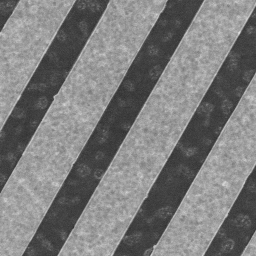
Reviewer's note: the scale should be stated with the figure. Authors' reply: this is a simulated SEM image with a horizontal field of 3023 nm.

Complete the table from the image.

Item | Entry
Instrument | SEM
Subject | one or a few lines or trenches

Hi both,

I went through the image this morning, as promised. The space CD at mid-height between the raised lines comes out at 378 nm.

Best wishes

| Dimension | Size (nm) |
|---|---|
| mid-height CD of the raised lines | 547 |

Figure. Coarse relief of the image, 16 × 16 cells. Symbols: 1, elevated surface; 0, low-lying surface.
0111000111000111
1111001111001110
1110001110011110
1110011100011100
1100111100111100
1100111000111001
1001111001110001
0001110001110011
0011110011100011
0011100111100111
0111000111000111
1111001111001110
1110001110011110
1110011100011100
1100111100111100
1100111000111001